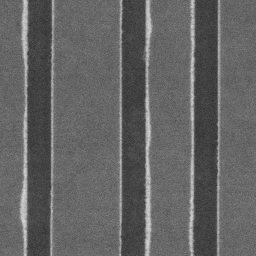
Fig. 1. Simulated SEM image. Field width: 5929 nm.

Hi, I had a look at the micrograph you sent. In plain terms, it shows lines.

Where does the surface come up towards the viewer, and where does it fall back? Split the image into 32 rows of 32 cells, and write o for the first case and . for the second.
ooo....oooooooo...oooooo...ooooo
ooo....oooooooo...oooooo...ooooo
ooo....oooooooo...oooooo...ooooo
ooo....oooooooo...oooooo...ooooo
ooo....oooooooo...oooooo...ooooo
ooo....oooooooo...oooooo...ooooo
ooo....oooooooo...oooooo...ooooo
ooo...ooooooooo...oooooo...ooooo
ooo....oooooooo...oooooo...ooooo
ooo...ooooooooo...oooooo...ooooo
ooo...ooooooooo...oooooo...ooooo
ooo...ooooooooo...oooooo...ooooo
ooo...ooooooooo...oooooo...ooooo
ooo...ooooooooo...oooooo...ooooo
ooo...ooooooooo...oooooo...ooooo
ooo...ooooooooo...oooooo...ooooo
ooo...ooooooooo...oooooo...ooooo
ooo...ooooooooo...oooooo...ooooo
ooo...ooooooooo...oooooo...ooooo
ooo...ooooooooo...oooooo...ooooo
ooo...ooooooooo...oooooo...ooooo
ooo...ooooooooo...oooooo...ooooo
ooo...ooooooooo...oooooo...ooooo
ooo...ooooooooo...oooooo...ooooo
ooo...ooooooooo...oooooo...ooooo
ooo...ooooooooo...oooooo...ooooo
ooo...ooooooooo...oooooo...ooooo
ooo...ooooooooo...oooooo...ooooo
ooo...ooooooooo...oooooo...ooooo
ooo...ooooooooo...oooooo...ooooo
ooo...ooooooooo...oooooo...ooooo
ooo...ooooooooo...oooooo...ooooo